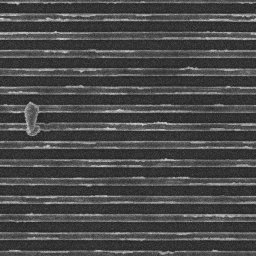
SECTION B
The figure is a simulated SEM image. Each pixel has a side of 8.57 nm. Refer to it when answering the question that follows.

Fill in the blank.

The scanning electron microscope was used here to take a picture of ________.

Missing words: parallel lines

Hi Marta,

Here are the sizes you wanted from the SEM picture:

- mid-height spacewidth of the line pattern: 97.4 nm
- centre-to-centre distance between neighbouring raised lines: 156 nm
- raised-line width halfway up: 61 nm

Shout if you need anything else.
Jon